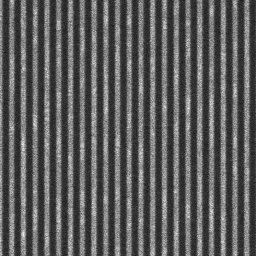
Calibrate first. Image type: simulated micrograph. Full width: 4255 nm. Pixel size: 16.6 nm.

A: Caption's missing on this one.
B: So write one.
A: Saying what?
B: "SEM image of parallel lines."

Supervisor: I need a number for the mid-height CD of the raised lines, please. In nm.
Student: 87.3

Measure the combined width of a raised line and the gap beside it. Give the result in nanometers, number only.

195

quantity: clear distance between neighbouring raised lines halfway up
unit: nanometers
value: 102